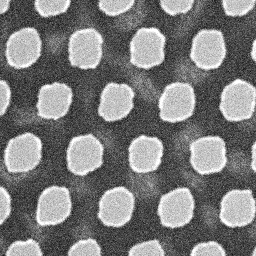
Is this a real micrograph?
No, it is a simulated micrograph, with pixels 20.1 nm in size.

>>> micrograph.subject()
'a regular array of raised bodies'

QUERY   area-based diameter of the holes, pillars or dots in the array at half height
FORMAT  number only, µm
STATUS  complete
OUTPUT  0.736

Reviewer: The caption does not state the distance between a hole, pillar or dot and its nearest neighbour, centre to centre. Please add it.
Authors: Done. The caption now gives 1220 nm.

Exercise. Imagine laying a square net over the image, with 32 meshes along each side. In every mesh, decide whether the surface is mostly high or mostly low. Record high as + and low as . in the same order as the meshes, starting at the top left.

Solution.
+....+++.....+++....++++....++++
.....+++.....++......++.....+++.
................................
................................
..+++....+++.....+++.....+++....
.++++....++++...++++....++++....
.++++....++++...++++....++++....
.+++.....+++....++++....++++....
................................
................................
+.....................+......++.
+....++++....+++.....+++....++++
+....++++....+++....++++....++++
+....++++...++++....++++....++++
.....+++.....+++....++++....+++.
................................
................................
..+++....+++.....+++.....+++....
.++++....++++...++++....++++....
.++++....++++...++++....++++....
.++++....++++...++++....++++....
.........++..............+......
................................
......++........................
+....++++....++++....+++....+++.
+....++++....++++...++++....++++
+....++++....+++....++++....++++
+....+++.....+++....++++....+++.
................................
................................
..+++.....++......++......+.....
.++++....+++....++++....++++....